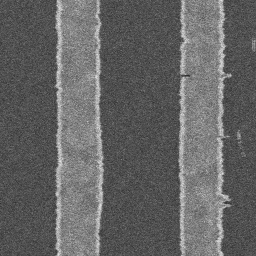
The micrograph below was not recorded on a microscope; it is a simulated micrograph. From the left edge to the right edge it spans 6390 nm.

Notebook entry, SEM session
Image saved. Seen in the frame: one or a few lines or trenches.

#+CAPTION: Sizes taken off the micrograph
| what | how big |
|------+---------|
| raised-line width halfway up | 0.974 microns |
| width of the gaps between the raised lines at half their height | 2090 nanometres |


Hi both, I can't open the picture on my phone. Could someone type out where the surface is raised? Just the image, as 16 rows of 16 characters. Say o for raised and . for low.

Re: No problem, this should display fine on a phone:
....oo.....ooo..
....oo.....ooo..
....oo.....ooo..
....oo.....ooo..
....oo......oo..
....oo.....ooo..
....oo.....ooo..
....oo.....ooo..
....oo.....ooo..
....oo.....ooo..
....oo.....ooo..
....oo.....ooo..
....oo.....ooo..
....oo.....ooo..
....oo.....ooo..
....oo.....ooo..